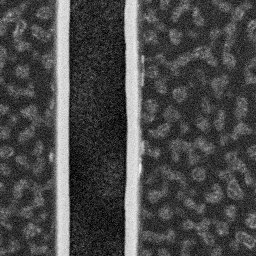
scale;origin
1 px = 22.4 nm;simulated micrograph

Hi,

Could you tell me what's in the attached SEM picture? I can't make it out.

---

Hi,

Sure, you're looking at one or a few lines or trenches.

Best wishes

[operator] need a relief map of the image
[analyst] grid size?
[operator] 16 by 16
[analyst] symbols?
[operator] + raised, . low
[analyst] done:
++++....++++++++
++++....++++++++
++++....++++++++
++++....++++++++
++++....++++++++
++++....++++++++
++++....++++++++
++++....++++++++
++++....++++++++
++++....++++++++
++++....++++++++
++++....++++++++
++++....++++++++
++++....++++++++
++++....++++++++
++++....++++++++